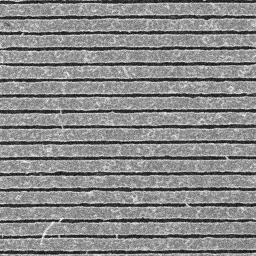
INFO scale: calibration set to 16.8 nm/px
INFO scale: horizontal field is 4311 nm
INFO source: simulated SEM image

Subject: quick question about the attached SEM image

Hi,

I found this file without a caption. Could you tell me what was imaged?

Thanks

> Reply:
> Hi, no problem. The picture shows parallel lines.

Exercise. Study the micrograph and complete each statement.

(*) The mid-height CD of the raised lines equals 196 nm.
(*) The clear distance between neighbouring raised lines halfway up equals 65.3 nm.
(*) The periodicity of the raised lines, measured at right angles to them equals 264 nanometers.